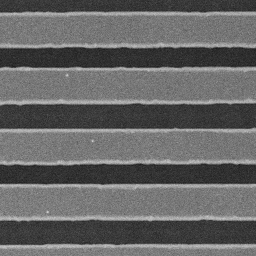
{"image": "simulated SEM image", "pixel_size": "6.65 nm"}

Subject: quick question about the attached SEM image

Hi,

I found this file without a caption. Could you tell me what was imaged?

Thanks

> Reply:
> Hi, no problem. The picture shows lines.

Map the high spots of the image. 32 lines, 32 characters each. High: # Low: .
................................
................................
################################
################################
################################
################################
................................
................................
#.##.....#.....#....#..#########
################################
################################
################################
################################
................................
................................
................................
################################
################################
################################
################################
#########.......................
................................
................................
################################
################################
################################
################################
................................
................................
................................
................................
################################